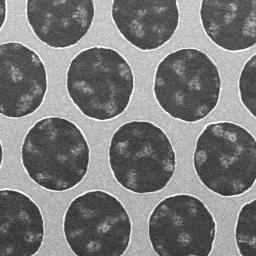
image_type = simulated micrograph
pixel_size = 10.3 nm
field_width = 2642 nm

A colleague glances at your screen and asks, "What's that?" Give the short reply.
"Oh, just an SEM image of holes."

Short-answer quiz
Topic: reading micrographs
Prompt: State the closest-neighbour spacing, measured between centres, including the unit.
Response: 0.872 µm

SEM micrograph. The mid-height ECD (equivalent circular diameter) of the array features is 724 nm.